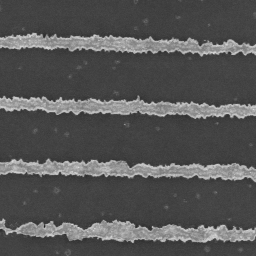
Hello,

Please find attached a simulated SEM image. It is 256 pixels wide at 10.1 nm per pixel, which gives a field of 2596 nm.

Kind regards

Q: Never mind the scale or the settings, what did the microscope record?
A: one or a few lines or trenches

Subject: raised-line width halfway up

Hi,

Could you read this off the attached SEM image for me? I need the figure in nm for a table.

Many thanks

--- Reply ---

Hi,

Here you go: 109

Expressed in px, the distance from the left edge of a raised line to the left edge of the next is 62.3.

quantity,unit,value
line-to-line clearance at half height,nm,525